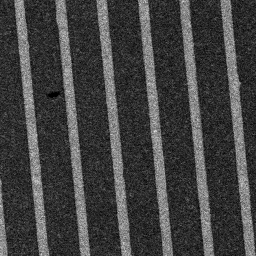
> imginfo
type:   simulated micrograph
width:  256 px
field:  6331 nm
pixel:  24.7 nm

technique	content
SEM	parallel lines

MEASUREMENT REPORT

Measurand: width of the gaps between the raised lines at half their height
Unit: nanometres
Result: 788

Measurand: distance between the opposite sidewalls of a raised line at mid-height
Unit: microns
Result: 0.234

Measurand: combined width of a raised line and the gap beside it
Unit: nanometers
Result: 1020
